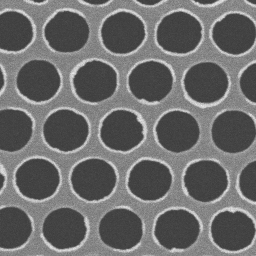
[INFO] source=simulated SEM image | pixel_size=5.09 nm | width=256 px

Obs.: a regular array of holes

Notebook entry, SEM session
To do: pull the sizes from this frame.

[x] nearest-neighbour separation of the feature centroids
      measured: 284 nm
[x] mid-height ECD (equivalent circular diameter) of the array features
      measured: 0.216 µm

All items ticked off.